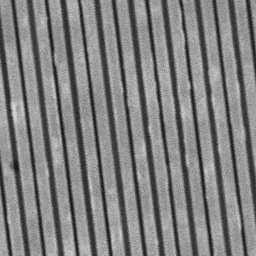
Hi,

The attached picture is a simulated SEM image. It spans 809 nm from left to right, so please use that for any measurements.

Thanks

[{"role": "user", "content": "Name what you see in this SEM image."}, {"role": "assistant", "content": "parallel lines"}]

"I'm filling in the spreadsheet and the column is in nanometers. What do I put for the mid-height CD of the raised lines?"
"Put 36.8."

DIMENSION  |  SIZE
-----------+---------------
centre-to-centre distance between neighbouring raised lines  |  52.6 nanometers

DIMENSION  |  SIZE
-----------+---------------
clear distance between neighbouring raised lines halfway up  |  14.5 nm